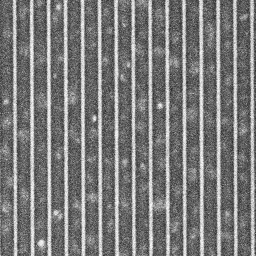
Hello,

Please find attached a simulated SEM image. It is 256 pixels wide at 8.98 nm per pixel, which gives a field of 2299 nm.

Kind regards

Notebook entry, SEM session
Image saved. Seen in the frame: parallel lines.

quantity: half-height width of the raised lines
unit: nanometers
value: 23.6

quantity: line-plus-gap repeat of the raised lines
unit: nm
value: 152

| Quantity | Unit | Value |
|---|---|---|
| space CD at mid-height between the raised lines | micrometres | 0.129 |